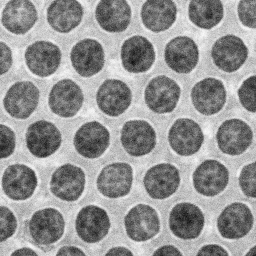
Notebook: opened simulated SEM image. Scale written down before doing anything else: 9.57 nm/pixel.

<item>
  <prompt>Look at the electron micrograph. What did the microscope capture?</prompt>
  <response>a regular array of holes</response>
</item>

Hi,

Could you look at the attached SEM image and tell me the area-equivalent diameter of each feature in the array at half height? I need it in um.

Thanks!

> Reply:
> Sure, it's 0.362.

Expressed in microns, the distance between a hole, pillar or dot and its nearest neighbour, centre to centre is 0.44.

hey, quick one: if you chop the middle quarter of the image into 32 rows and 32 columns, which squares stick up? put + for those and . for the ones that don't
++........++++........++++......
+++.......+++++......++++++.....
+++.....++++++++++++++++++++++++
.++++.++++++.+++++++++.....+++++
...+++++++.....++++++.......++++
....+++++.......+++++........+++
....++++.........+++.........+++
.....+++.........+++.........++.
.....+++.........+++.........+++
.....+++.........+++.........+++
.....+++.........++++.......++++
....+++++.......++++++......++++
...+++++++.....+++++++++.+++++++
..+++++++++++++++++++++++++++..+
+++++....+++++++.....++++++.....
++++......+++++.......+++++.....
+++........+++.........+++......
+++.........++.........+++......
++..........++.........+++......
++..........++.........+++......
++.........+++.........+++......
+++........++++.......+++++.....
++++......++++++.....+++++++....
++++++..++++++++++++++++++++++++
+++++++++++++..++++++++++.++++++
...+++++++.......+++++......++++
.....++++........++++........+++
.....++++.........++.........+++
.....+++..........++.........+++
.....+++.........+++.........+++
.....+++.........+++.........+++
.....+++.........+++........++++